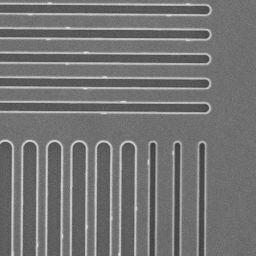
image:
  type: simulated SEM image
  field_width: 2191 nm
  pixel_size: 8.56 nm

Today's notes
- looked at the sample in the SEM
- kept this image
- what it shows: groups of lines, slits or small figures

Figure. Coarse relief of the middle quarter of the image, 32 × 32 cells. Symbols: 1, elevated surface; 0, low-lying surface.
11111111111111111111111111111111
11111111111111111111111111111111
11111111111111111111111111111111
00011111111111111111111111111111
00000000000000000000000000000000
00000000000000000000000000000000
11111111111111111111111111111111
11111111111111111111111111111111
11111111111111111111111111111111
00000000111111111111111111111111
00000000000000000000000000000000
00000000000000000000000000000000
11111111111111111111111111111111
11111111111111111111111111111111
11111111111111111111111111111111
11111111111111111111111111111111
11111111111111111111111111111111
11111111111111111111111111111111
11111111111111111111111111111111
11101111111111111111111111111111
11000111000011000011100111110111
11000011000011000011100111110111
11000011000011000011100111110111
11000011000011000011100111110111
11000011000011000011100111110111
11000011000011000011100111110111
11000011000011000011100111110111
11000011000011000011100111110111
11000011000011000011100111110111
11000011000011000011100111100111
11000011000011000011100111100111
11000011000011000011100111100111